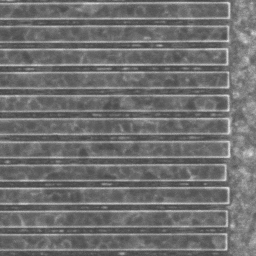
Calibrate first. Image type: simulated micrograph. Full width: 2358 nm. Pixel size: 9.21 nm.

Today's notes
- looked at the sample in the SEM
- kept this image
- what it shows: parallel lines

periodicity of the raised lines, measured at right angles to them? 213 nm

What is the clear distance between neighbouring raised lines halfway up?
65.6 nm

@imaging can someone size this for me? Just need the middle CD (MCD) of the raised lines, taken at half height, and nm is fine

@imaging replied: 148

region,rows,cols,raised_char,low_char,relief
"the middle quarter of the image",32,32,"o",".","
................................
................................
oooooooooooooooooooooooooooooooo
oooooooooooooooooooooooooooooooo
oooooooooooooooooooooooooooooooo
oooooooooooooooooooooooooooooooo
................................
................................
oooooooooooooooooooooooooooooooo
oooooooooooooooooooooooooooooooo
oooooooooooooooooooooooooooooooo
oooooooooooooooooooooooooooooooo
................................
................................
oooooooooooooooooooooooooooooooo
oooooooooooooooooooooooooooooooo
oooooooooooooooooooooooooooooooo
oooooooooooooooooooooo..........
................................
................................
oooooooooooooooooooooooooooooooo
oooooooooooooooooooooooooooooooo
oooooooooooooooooooooooooooooooo
................................
................................
oooooooooooooooooooooooooooooooo
oooooooooooooooooooooooooooooooo
oooooooooooooooooooooooooooooooo
oooooooooooooooooooooooooooooooo
................................
................................
oooooooooooooooooooooooooooooooo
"